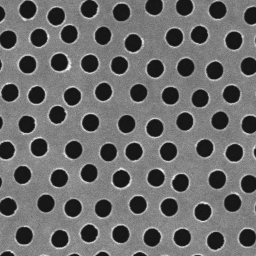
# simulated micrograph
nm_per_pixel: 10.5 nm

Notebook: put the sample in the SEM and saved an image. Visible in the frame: a regular array of holes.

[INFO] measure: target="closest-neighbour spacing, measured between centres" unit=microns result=0.302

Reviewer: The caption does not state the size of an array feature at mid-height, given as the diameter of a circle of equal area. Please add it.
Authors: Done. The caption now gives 184 nanometres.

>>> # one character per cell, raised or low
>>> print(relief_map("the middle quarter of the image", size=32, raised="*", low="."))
.***.....***....*****....***....
*****...****....*****....***....
*************.*******...*****...
********************************
********************************
*********..******...************
*...****....*****....****...****
....****....*****....****....***
....****...******...*****....***
....*********************...****
********************************
********************************
*****************************...
*****...******...***********....
*****....*****....***...****....
*****....*****....***....***....
******..******...***.....****..*
*********************...********
********************************
*...*************.**************
*...******...***...******...****
.....****....**.....****....****
....*****....**.....****....****
*...*****....***...******..*****
********************************
*****..*************************
****....**************..********
.***....*****...*****....****.**
.***....****....*****....***...*
.*****.*****....*****....**....*
*************..*******..***....*
****************************..**